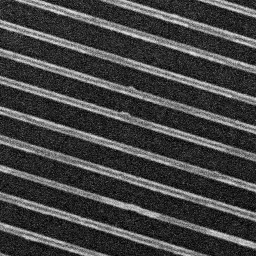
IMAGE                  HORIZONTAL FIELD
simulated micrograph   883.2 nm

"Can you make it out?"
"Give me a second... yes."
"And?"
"parallel lines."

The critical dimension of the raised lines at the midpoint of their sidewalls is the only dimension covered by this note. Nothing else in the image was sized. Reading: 22.8 nm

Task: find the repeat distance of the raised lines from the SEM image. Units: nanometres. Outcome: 95.8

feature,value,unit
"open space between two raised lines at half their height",71.4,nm